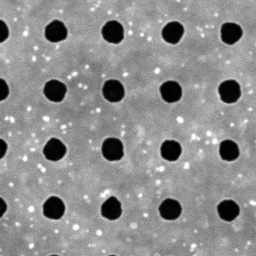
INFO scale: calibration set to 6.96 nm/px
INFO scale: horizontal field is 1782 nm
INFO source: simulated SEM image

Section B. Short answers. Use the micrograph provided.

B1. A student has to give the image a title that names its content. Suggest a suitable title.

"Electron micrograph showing a regular array of holes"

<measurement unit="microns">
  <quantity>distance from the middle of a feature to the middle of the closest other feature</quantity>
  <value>0.404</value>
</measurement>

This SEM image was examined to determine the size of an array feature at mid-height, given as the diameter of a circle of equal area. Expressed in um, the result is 0.158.